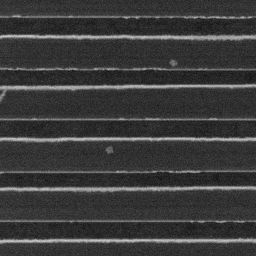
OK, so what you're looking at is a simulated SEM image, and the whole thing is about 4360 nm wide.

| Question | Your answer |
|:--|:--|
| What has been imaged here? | lines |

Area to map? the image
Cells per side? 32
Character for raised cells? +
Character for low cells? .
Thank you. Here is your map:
++++++++++++++++++++++++++++++++
++++++++++++++++++++++++++++++++
................................
................................
................................
++++++++++++++++++++++++++++++++
++++++++++++++++++++++++++++++++
++++++++++++++++++++++++++++++++
++++++++++++++++++++++++++++++++
................................
................................
++++++++++++++++++++++++++++++++
++++++++++++++++++++++++++++++++
++++++++++++++++++++++++++++++++
++++++++++++++++++++++++++++++++
................................
................................
++......++++++++++++++++++++...+
++++++++++++++++++++++++++++++++
++++++++++++++++++++++++++++++++
++++++++++++++++++++++++++++++++
+...............................
................................
................................
++++++++++++++++++++++++++++++++
++++++++++++++++++++++++++++++++
++++++++++++++++++++++++++++++++
++++++++++++++++++++++++++++++++
................................
................................
++++++++++++++++++++++++++++++++
++++++++++++++++++++++++++++++++